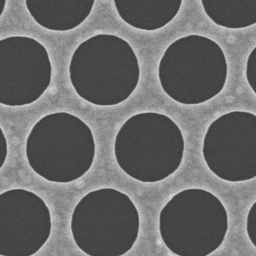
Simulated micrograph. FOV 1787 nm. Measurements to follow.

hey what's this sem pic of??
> holes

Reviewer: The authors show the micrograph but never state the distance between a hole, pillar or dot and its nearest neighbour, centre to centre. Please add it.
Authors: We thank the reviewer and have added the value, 618 nanometres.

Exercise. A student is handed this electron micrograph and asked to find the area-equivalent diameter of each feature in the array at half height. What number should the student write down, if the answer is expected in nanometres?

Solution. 486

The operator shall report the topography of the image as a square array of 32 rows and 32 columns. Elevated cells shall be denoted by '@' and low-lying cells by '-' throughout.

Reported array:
-@@---------@@---------@@-------
@@@@-------@@@@-------@@@@------
@@@@-------@@@@------@@@@@------
@@@@@@---@@@@@@@@---@@@@@@@@@-@@
@@@@@@@@@@@@--@@@@@@@@@--@@@@@@@
-----@@@@@------@@@@@------@@@@@
------@@@--------@@@@-------@@@-
------@@@--------@@@--------@@@-
------@@@--------@@@--------@@@-
------@@@--------@@@--------@@@-
------@@@--------@@@--------@@@-
-----@@@@@-------@@@@------@@@@@
-----@@@@@@-----@@@@@@----@@@@@@
@@@@@@@@@@@@@@@@@@@@@@@@@@@@@@@@
@@@@@@---@@@@@@@@----@@@@@@@----
@@@@-------@@@@-------@@@@------
@@@@-------@@@@--------@@@------
-@@---------@@---------@@-------
-@@---------@@---------@@-------
-@@---------@@---------@@-------
@@@@-------@@@@--------@@@------
@@@@-------@@@@@------@@@@@-----
@@@@@@---@@@@@@@@---@@@@@@@@---@
@@@@@@@@@@@@@@@@@@@@@@@@@@@@@@@@
-----@@@@@@-----@@@@@@-----@@@@@
------@@@@-------@@@@-------@@@@
------@@@--------@@@--------@@@-
------@@@--------@@@--------@@@-
------@@@--------@@@--------@@@-
------@@@--------@@@--------@@@-
-----@@@@@-------@@@@-------@@@@
-----@@@@@@-----@@@@@@----@@@@@@